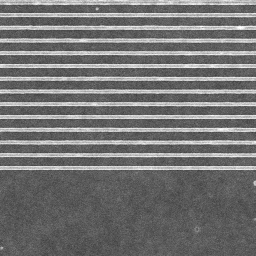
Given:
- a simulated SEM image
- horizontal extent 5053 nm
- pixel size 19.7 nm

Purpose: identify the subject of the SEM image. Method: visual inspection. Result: parallel lines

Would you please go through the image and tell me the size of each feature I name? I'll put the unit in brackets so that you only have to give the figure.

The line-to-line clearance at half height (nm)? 183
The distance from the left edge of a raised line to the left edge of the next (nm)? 252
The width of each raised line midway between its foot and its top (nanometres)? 69.1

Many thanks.